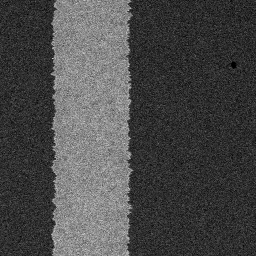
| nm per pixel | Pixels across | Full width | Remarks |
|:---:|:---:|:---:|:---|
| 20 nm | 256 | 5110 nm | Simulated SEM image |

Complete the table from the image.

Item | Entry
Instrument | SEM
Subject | one or a few lines or trenches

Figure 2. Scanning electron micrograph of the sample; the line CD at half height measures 1480 nm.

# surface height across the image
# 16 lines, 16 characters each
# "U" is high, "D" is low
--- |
DDDUUUUUDDDDDDDD
DDDUUUUUDDDDDDDD
DDDUUUUUDDDDDDDD
DDDUUUUUDDDDDDDD
DDDUUUUUDDDDDDDD
DDDUUUUUDDDDDDDD
DDDUUUUUDDDDDDDD
DDDUUUUUDDDDDDDD
DDDUUUUUDDDDDDDD
DDDUUUUUDDDDDDDD
DDDUUUUUDDDDDDDD
DDDUUUUUDDDDDDDD
DDDUUUUUDDDDDDDD
DDDUUUUUDDDDDDDD
DDDUUUUUDDDDDDDD
DDDUUUUUDDDDDDDD